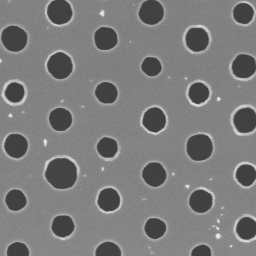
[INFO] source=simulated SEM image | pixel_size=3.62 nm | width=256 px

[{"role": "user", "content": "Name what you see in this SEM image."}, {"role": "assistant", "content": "a regular array of holes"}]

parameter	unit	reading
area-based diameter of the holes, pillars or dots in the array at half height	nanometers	81.9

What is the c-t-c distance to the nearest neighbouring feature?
52.5 pixels